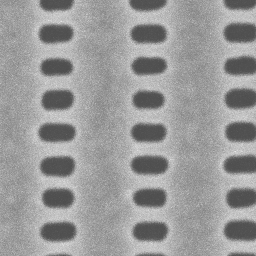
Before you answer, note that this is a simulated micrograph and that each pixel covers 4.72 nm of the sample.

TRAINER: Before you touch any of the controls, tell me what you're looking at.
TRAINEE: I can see a regular array of holes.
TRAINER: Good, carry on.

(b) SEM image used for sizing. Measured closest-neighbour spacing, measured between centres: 154 nanometers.